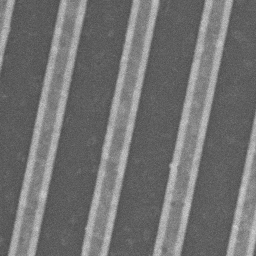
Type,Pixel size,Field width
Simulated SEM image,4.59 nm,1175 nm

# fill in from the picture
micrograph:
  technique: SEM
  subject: one or a few lines or trenches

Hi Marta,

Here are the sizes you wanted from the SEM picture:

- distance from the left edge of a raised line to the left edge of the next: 327 nm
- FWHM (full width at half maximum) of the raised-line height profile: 87.1 nanometres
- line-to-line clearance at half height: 238 nm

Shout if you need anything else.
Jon